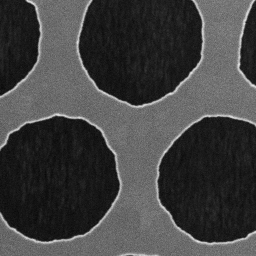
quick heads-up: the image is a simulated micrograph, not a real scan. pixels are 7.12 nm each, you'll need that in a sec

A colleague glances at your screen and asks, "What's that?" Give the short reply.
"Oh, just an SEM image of holes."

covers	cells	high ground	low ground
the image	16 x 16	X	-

--XXX-------XXXX
--XXX--------XX-
--XXX--------XX-
--XXX--------XX-
--XXX-------XXX-
-XXXXX-----XXXXX
XXXXXXXX-XXXXXXX
XXX--XXXXXXXX--X
X-----XXXXX-----
-------XXX------
-------XXX------
-------XXX------
-------XXX------
-------XXXX-----
X----XXXXXXX----
XXXXXXXXXXXXXXXX